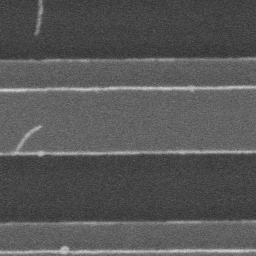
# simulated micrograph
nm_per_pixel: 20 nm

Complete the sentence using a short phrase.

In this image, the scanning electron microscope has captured lines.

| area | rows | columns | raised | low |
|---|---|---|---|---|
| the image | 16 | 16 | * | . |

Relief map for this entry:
................
................
................
................
****************
****************
****************
****************
****************
**********.*....
................
................
................
................
****************
****************